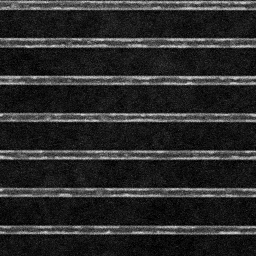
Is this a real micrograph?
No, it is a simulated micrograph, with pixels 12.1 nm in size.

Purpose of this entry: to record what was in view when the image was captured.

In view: parallel lines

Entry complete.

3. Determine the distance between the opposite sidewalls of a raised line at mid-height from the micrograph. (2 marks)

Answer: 96.8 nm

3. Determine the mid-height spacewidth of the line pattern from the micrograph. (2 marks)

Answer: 351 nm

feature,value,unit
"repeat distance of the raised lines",453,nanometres